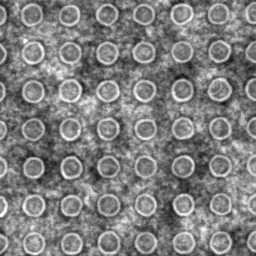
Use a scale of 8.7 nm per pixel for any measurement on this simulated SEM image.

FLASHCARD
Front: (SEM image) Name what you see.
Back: a regular array of raised bodies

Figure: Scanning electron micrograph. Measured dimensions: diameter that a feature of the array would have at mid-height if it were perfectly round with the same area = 20.9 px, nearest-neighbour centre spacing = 0.323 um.